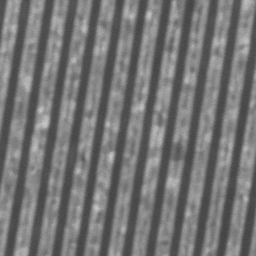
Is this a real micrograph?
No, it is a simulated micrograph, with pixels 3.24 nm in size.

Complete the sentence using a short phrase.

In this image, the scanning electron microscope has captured parallel lines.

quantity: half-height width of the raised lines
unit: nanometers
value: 38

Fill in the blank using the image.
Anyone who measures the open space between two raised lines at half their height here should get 37.6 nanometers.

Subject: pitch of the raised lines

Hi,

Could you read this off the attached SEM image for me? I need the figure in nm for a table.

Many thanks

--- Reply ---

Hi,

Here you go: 75.2